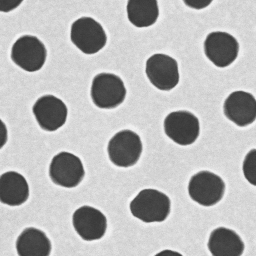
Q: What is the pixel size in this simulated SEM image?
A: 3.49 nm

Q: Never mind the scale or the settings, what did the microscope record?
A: a regular array of holes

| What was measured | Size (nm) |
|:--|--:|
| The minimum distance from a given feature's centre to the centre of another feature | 204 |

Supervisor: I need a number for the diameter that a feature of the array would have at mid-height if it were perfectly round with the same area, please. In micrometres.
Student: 0.121